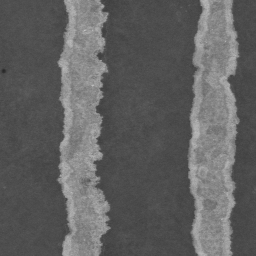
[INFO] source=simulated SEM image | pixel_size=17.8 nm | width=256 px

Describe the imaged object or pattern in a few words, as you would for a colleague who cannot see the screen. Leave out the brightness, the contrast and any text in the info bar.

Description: one or a few lines or trenches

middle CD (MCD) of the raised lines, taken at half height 0.55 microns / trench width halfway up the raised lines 1.77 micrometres